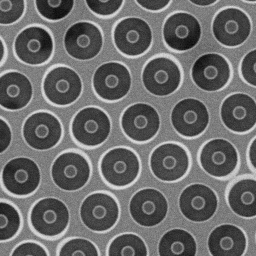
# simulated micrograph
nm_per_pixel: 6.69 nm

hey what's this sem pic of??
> an array of small figures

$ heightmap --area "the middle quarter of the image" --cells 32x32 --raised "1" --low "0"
11111111100000011111000000000111
00111111000000001111000000000111
00011110000000001110000111000111
00001110000110000111000111000011
10001110000110000111000010000111
10000110000110000111000000000111
10001110000000001111100000001111
00001111000000001111110000011111
00011111100000011111111111111110
00111111111111111111111111111000
11111111111111111000001111110000
11110000011111100000000111100000
11100000000111100000000111100011
11000000000111000011000011100011
11000011000011000011100011100001
11000111000011000011000011100000
11000011000011100000000011110000
11000000000111100000000111111000
11000000000111110000001111111111
11100000001111111100111111111111
11111000111111111111111000000111
11111111111000000111110000000001
00000111110000000011110000000001
00000011110000000001110001100001
00000011100001100001100001110000
01000001100001100001100001110001
11100001100001100001110000000001
11100001100000000001110000000001
00000011110000000011111000000111
00000011110000000111111111011111
00000111111100001111111111111110
00011111111111111110000111111100